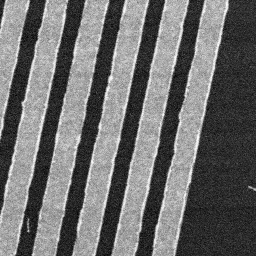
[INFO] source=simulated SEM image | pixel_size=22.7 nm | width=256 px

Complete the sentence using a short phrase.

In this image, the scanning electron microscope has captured parallel lines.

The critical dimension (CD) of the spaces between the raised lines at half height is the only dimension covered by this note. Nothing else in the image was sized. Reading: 398 nm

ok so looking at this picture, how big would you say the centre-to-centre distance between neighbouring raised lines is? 886 nanometres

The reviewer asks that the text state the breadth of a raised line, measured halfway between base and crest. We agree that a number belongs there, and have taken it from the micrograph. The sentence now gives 481 nm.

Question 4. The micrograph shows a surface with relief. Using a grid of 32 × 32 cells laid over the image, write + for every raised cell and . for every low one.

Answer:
.+++..++...++...++...++...++....
+++...++..+++..+++..+++..+++....
+++..+++..+++..+++..+++..+++....
+++..+++..+++..+++..+++..+++....
+++..+++..+++..+++..+++..+++....
++...++...++...++...++...++.....
++..+++..+++..+++..+++..+++.....
++..+++..+++..+++..+++..+++.....
++..+++..+++..+++..+++..+++.....
++..+++..++...+++..++...++......
+...++..+++...++...++..+++......
+..+++..+++..+++..+++..+++......
+..+++..+++..+++..+++..+++......
+..+++..+++..+++..+++..+++......
...+++..+++..++...++..+++.......
..+++..+++..+++..+++..+++.......
..+++..+++..+++..+++..+++.......
..+++..+++..+++..+++..+++.......
..+++..+++..+++..+++..+++.......
..++...++...++...++...++........
..++..+++..+++..+++..+++........
.+++..+++..+++..+++..+++........
.+++..+++..+++..+++..+++........
.+++..+++..+++..+++..++.........
.++...++...++...++...++.........
+++..+++..+++..+++..+++.........
+++..+++..+++..+++..+++.........
+++..+++..+++..+++..+++.........
+++..+++..+++..+++..++..........
++...++...++...++..+++..........
++..+++..+++..+++..+++..........
++..+++..+++..+++..+++..........